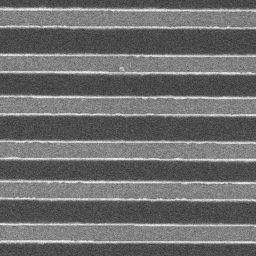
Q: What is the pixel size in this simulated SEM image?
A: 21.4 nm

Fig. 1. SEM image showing lines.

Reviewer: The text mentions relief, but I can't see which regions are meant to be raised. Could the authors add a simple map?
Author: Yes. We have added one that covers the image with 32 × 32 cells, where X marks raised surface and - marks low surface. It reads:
XXXXXXXXXXXXXXXXXXXXXXXXXXXXXXXX
--------------------------------
--------------------------------
XXXXXXXXXXXXXXXXXXXXX-XXXXXX----
XXXXXXXXXXXXXXXXXXXXXXXXXXXXXXXX
XXXXXXXXXXXXXXXXXXXXXXXXXXXXXXXX
XXXXXXXXXXXXXXXXXXXXXXXXXXXXXXXX
--------------------------------
--------------------------------
XXXXXXXXXXXXXXXXXXXXXXXXXXXXXXXX
XXXXXXXXXXXXXXXXXXXXXXXXXXXXXXXX
XXXXXXXXXXXXXXXXXXXXXXXXXXXXXXXX
--------------------------------
--------------------------------
XXXXXXXXXXXXXXXXXXXXXXXXXXXXXXXX
XXXXXXXXXXXXXXXXXXXXXXXXXXXXXXXX
XXXXXXXXXXXXXXXXXXXXXXXXXXXXXXXX
XXXXXXXXXXXXXXXXXXXXXXXXXXXXXXXX
--------------------------------
--------------------------------
XXXXXXXXXXXXXXXXXXXXXXXXXXXXXXXX
XXXXXXXXXXXXXXXXXXXXXXXXXXXXXXXX
XXXXXXXXXXXXXXXXXXXXXXXXXXXXXXXX
--------------------------------
--------------------------------
XXXXXXXXXXXXXXXXXXXXXXXXXXXXXXXX
XXXXXXXXXXXXXXXXXXXXXXXXXXXXXXXX
XXXXXXXXXXXXXXXXXXXXXXXXXXXXXXXX
--------------------------------
--------------------------------
XXXXXXXXXXXXXXXXXXXXXXXXXXXXXXXX
XXXXXXXXXXXXXXXXXXXXXXXXXXXXXXXX